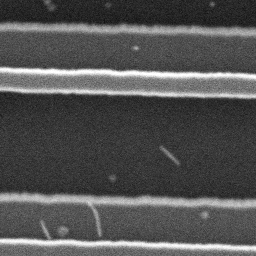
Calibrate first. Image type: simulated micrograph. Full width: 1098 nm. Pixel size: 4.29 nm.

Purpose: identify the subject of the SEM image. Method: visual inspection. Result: lines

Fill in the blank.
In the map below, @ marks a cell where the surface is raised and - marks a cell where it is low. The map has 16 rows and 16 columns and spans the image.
----------------
----------------
@@@@@@@@@@@@@@@@
@@@@@@@@@@@@@@@@
@@@@@@@@@@@@@@@@
@@@@@@@@@@@@@@@@
----------------
----------------
----------------
----------------
----------------
----------------
@@@@@-----------
@@@@@@@@@@@@@@@@
@@@@@@@@@@@@@@@@
@@@@@@@@@@@@@@@@